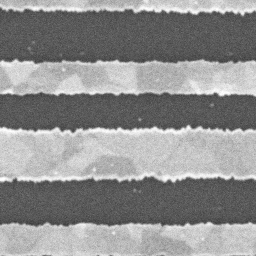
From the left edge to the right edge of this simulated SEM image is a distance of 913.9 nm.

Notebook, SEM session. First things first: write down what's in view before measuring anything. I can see lines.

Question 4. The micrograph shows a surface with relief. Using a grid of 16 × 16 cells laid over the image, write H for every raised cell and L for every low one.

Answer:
HHHHHHHHHHHHHHHH
LLLLLLLLLLLLLLLL
LLLLLLLLLLLLLLLL
LLLLLLLLLLLLLLLL
HHHHHHHHHHHHHHHH
HHHHHHHHHHHHHHHH
LLLLLLLLLLLLLLLL
LLLLLLLLLLLLLLLL
HHHHHHHHHHHHHHHH
HHHHHHHHHHHHHHHH
HHHHHHHHHHHHHHHH
LLLLLLLLLLLLLLLL
LLLLLLLLLLLLLLLL
LLLLLLLLLLLLLLLL
HHHHHHHHHHHHHHHH
HHHHHHHHHHHHHHHH